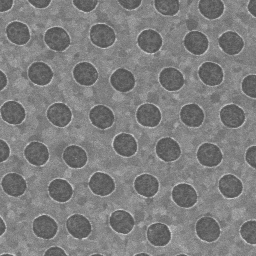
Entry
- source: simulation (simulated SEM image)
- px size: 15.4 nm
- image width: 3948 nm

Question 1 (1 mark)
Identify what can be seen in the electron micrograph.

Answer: a regular array of holes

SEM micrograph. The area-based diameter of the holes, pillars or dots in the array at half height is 0.382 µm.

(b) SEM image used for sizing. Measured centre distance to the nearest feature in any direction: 0.594 micrometres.